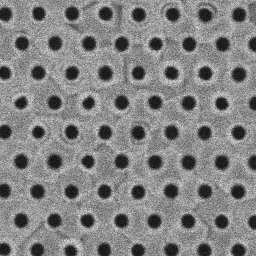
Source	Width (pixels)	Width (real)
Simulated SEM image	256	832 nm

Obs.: a regular array of holes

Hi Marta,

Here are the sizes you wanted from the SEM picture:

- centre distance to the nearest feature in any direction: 108 nm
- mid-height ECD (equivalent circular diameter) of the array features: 43.6 nanometres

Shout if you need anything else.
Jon